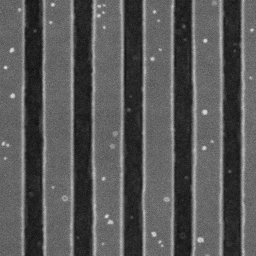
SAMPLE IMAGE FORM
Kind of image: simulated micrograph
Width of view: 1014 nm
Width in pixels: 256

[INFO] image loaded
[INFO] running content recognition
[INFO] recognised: lines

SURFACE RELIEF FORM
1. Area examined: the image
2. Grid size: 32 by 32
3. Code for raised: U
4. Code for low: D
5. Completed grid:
UUUDDUUUUDDDUUUDDDUUUUDDUUUUDDUU
UUUDDUUUUDDDUUUDDDUUUUDDUUUUDDUU
UUUDDUUUUDDDUUUDDDUUUUDDUUUUDDUU
UUUDDUUUUDDDUUUDDDUUUUDDUUUUDDUU
UUUDDUUUUDDDUUUDDDUUUUDDUUUUDDUU
UUUDDUUUUDDDUUUDDDUUUUDDUUUUDDUU
UUUDDUUUUDDDUUUDDDUUUUDDUUUUDDUU
UUUDDUUUUDDDUUUDDDUUUUDDUUUUDDUU
UUUDDUUUUDDDUUUDDDUUUUDDUUUUDDUU
UUUDDUUUUDDDUUUDDDUUUUDDUUUUDDUU
UUUDDUUUUDDDUUUDDDUUUUDDUUUUDDUU
UUUDDUUUUDDDUUUDDDUUUUDDUUUUDDUU
UUUDDUUUUDDDUUUDDDUUUUDDUUUUDDUU
UUUDDUUUUDDDUUUDDDUUUUDDUUUUDDUU
UUUDDUUUUDDDUUUDDDUUUUDDUUUUDDUU
UUUDDUUUUDDDUUUDDDUUUUDDUUUUDDUU
UUUDDUUUUDDDUUUDDDUUUUDDUUUUDDUU
UUUDDUUUUDDDUUUDDDUUUUDDUUUUDDUU
UUUDDUUUUDDDUUUDDDUUUUDDUUUUDDUU
UUUDDUUUUDDDUUUDDDUUUUDDUUUUDDUU
UUUDDUUUUDDDUUUDDDUUUUDDUUUUDDUU
UUUDDUUUUDDDUUUDDDUUUUDDUUUUDDUU
UUUDDUUUUDDDUUUDDDUUUUDDUUUUDDUU
UUUDDUUUUDDDUUUDDDUUUUDDUUUUDDUU
UUUDDUUUUDDDUUUDDDUUUUDDUUUUDDUU
UUUDDUUUUDDDUUUDDDUUUUDDUUUUDDUU
UUUDDUUUUDDDUUUDDDUUUUDDUUUUDDUU
UUUDDUUUUDDDUUUDDDUUUUDDUUUUDDUU
UUUDDUUUUDDDUUUDDDUUUUDDUUUUDDUU
UUUDDDUUUDDDUUUDDDUUUUDDUUUUDDUU
UUUDDUUUUDDDUUUDDDUUUUDDUUUUDDUU
UUUDDUUUUDDDUUUDDDUUUUDDUUUUDDUU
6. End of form